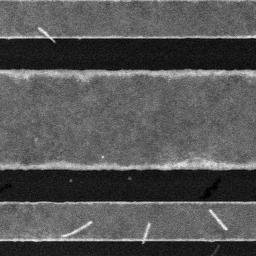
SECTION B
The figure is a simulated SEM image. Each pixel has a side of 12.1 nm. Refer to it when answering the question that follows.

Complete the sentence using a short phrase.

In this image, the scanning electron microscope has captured lines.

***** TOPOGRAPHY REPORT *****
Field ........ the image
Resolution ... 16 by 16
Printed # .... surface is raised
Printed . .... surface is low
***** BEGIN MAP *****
################
################
................
................
################
################
################
################
################
################
################
................
................
################
################
................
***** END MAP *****